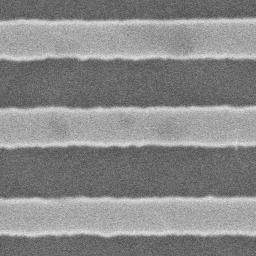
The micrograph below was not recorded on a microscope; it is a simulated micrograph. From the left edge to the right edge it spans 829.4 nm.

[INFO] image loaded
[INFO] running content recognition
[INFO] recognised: lines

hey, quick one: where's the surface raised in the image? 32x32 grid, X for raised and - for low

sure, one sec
--------------------------------
--------------------------------
--X-X------------------XXXXXXXXX
XXXXXXXXXXXXXXXXXXXXXXXXXXXXXXXX
XXXXXXXXXXXXXXXXXXXXXXXXXXXXXXXX
XXXXXXXXXXXXXXXXXXXXXXXXXXXXXXXX
XXXXXXXXXXXXXXXXXXXXXXXXXXXXXXXX
--------------------------------
--------------------------------
--------------------------------
--------------------------------
--------------------------------
--------------------------------
------X---------X--XX-XXXXXXX-XX
XXXXXXXXXXXXXXXXXXXXXXXXXXXXXXXX
XXXXXXXXXXXXXXXXXXXXXXXXXXXXXXXX
XXXXXXXXXXXXXXXXXXXXXXXXXXXXXXXX
XXXXXXXXXXXXXXXXXXXXXXXXXXXXXXXX
--------------------------------
--------------------------------
--------------------------------
--------------------------------
--------------------------------
--------------------------------
--------------------------------
XXXXXXXXXXXXXXXXXXXXXXXXXXXXXXXX
XXXXXXXXXXXXXXXXXXXXXXXXXXXXXXXX
XXXXXXXXXXXXXXXXXXXXXXXXXXXXXXXX
XXXXXXXXXXXXXXXXXXXXXXXXXXXXXXXX
-------------X------------------
--------------------------------
--------------------------------